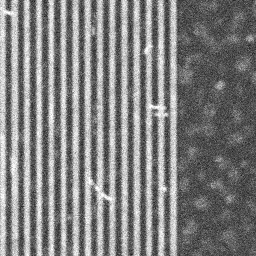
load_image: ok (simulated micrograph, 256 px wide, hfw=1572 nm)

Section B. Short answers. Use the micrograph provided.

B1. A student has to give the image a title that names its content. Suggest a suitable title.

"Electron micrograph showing parallel lines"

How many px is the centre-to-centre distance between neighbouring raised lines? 12.2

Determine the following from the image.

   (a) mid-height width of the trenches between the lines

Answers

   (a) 52.2 nm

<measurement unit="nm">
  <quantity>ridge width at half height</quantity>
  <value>26.1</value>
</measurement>